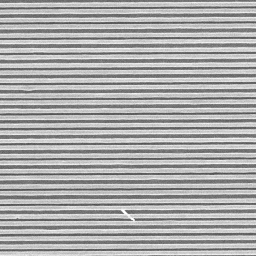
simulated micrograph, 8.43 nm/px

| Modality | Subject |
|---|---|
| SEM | parallel lines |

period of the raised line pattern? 63.5 nm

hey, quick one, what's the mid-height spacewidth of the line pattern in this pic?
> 0.0253 micrometres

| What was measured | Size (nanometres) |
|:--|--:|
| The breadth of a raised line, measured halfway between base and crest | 33.7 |